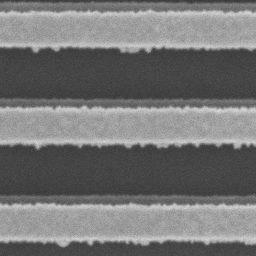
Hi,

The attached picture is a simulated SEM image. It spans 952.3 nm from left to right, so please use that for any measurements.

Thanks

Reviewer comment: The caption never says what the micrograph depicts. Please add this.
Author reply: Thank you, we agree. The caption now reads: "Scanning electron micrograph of lines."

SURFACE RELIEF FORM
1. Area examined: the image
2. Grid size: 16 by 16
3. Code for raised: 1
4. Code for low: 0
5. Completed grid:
1111111111111111
1111111111111111
1111111111111111
0000000000000000
0000000000000000
0000000000000000
1111111111111111
1111111111111111
1111111111111111
0000000000000000
0000000000000000
0000000000000000
1111111111111111
1111111111111111
1111111111111111
0000000000000000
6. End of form